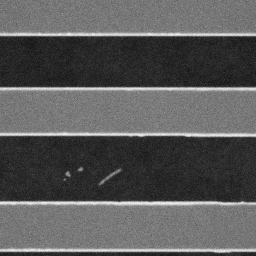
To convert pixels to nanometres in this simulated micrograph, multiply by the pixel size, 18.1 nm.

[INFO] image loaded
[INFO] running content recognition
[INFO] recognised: lines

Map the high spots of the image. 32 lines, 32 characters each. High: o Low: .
oooooooooooooooooooooooooooooooo
oooooooooooooooooooooooooooooooo
oooooooooooooooooooooooooooooooo
oooooooooooooooooooooooooooooooo
................................
................................
................................
................................
................................
................................
................................
oooooooooooooooooooooooooooooooo
oooooooooooooooooooooooooooooooo
oooooooooooooooooooooooooooooooo
oooooooooooooooooooooooooooooooo
oooooooooooooooooooooooooooooooo
oooooooooooooooooooooooooooooooo
................................
................................
................................
................................
................................
................................
................................
................................
oooooooooooooooooooooooooooooooo
oooooooooooooooooooooooooooooooo
oooooooooooooooooooooooooooooooo
oooooooooooooooooooooooooooooooo
oooooooooooooooooooooooooooooooo
oooooooooooooooooooooooooooooooo
...........................o....